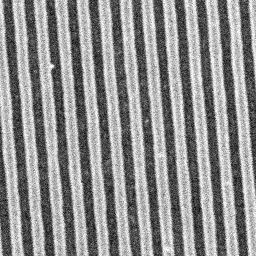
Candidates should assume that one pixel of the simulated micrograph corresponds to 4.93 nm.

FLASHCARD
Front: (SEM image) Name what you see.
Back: parallel lines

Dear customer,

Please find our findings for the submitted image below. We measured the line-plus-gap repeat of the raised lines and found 105 nanometers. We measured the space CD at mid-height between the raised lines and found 50.9 nm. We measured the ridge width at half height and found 11.1 px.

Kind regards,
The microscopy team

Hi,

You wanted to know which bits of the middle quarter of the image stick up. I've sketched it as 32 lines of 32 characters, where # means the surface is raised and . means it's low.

##...##...###..###...##...###...
##...##...###..###...###..###...
##...##...###..###...###..###...
##...##...###...##...###..###...
##...##...###...##...###..###...
##...###..###...###..###..###...
###..###...##...###..###...##...
###..###...##...###..###...##...
###..###...##...###...##...###..
###..###...##...###...##...###..
###..###...###...##...##...###..
###...##...###...##...##...###..
###...##...###...##...##...###..
###...##...###...##...###..###..
.##...###..###...##...###..###..
###...###..###...##...###...##..
.##...###..###...##...###...##..
.##...###...##...###..###...##..
.##...###...##...###..###...##..
.##...###...##...###..###...##..
.##...###...##...###...##...##..
.###...##...##...###...##...##..
.###...##...###..###...##...##..
.###...##...###..###...##...###.
.###...##...###...##...###..###.
.###...##...###...##...###..###.
.###...##...###...##...###..###.
.###...##...###...##...###...##.
..##...###...##...##...###...##.
..##...###...##...##...###...##.
..###..###...##...###..###...##.
..###..###...##...###..###...##.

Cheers